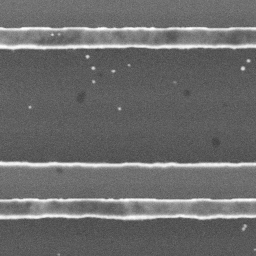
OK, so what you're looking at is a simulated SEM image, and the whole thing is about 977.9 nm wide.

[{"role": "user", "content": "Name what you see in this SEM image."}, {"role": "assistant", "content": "lines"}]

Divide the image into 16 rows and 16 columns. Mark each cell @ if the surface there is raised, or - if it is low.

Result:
@@@@@@@@@@@@@@@@
@@@@@@@@@@@@@@@@
@@@@@@@@@@@@@@@@
----------------
----------------
----------------
----------------
----------------
----------------
----------------
@@@@@@@@@@@@@@@@
@@@@@@@@@@@@@@@@
@@@@@@@@@@@@@@@@
@@@@@@@@@@@@@@@@
----------------
----------------